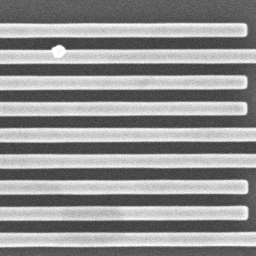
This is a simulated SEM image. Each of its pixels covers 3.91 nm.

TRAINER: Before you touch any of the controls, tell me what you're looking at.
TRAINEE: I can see groups of lines, slits or small figures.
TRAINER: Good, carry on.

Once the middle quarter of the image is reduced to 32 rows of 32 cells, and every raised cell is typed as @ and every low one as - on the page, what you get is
--------------------------------
--------------------------------
--------------------------------
@@@@@@@@@@@@@@@@@@@@@@@@@@@@@@@@
@@@@@@@@@@@@@@@@@@@@@@@@@@@@@@@@
@@@@@@@@@@@@@@@@@@@@@@@@@@@@@@@@
--------------------------------
--------------------------------
--------------------------------
--------------------------------
@@@@@@@@@@@@@@@@@@@@@@@@@@@@@@@@
@@@@@@@@@@@@@@@@@@@@@@@@@@@@@@@@
@@@@@@@@@@@@@@@@@@@@@@@@@@@@@@@@
--------------------------------
--------------------------------
--------------------------------
@@@@@@@@@@@@@@@@@@@@@@@@@@@@@@@@
@@@@@@@@@@@@@@@@@@@@@@@@@@@@@@@@
@@@@@@@@@@@@@@@@@@@@@@@@@@@@@@@@
--------------------------------
--------------------------------
--------------------------------
--------------------------------
@@@@@@@@@@@@@@@@@@@@@@@@@@@@@@@@
@@@@@@@@@@@@@@@@@@@@@@@@@@@@@@@@
@@@@@@@@@@@@@@@@@@@@@@@@@@@@@@@@
--------------------------------
--------------------------------
--------------------------------
@@@@@@@@@@@@@@@@@@@@@@@@@@@@@@@@
@@@@@@@@@@@@@@@@@@@@@@@@@@@@@@@@
@@@@@@@@@@@@@@@@@@@@@@@@@@@@@@@@